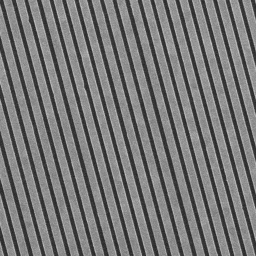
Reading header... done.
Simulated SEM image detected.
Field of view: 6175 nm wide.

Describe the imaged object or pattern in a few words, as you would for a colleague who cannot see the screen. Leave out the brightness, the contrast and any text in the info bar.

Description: parallel lines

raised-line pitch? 0.293 um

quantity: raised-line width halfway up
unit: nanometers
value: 181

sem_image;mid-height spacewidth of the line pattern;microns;0.114